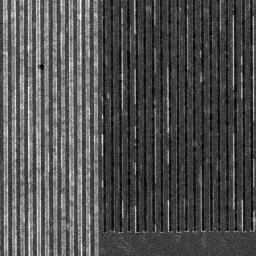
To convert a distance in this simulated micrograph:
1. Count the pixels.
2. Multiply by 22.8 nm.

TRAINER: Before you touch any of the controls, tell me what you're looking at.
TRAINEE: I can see parallel lines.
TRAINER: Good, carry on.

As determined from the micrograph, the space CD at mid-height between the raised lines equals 111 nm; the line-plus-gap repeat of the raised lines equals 187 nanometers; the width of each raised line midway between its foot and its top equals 0.0799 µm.